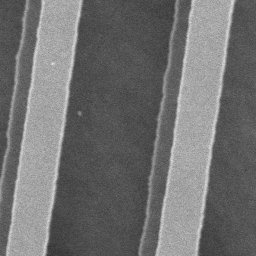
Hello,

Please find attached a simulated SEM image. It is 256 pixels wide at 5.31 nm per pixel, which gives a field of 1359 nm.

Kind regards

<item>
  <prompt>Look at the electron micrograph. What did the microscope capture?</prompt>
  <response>lines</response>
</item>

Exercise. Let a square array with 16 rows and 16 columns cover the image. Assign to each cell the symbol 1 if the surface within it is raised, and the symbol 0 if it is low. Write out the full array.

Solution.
0011100000011110
0111100000011100
0111100000011100
0111100000011100
0111000000111100
0111000000111100
0111000000111100
0111000000111100
1111000000111000
1111000000111000
1111000001111000
1110000001111000
1110000001111000
1110000001111000
1110000001111000
1110000001110000